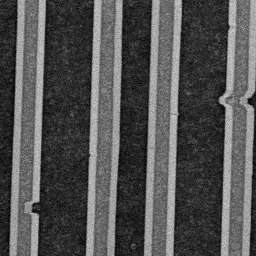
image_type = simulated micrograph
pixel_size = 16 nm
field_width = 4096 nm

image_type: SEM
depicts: one or a few lines or trenches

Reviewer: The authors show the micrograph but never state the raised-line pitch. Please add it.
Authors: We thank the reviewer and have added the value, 1130 nanometers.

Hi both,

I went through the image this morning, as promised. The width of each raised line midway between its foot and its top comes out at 348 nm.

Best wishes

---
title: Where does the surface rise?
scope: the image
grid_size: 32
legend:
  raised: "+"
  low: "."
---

...++.......+++....+++.......+++
...++.......+++....+++.......+++
...++.......+++....+++.......+++
...++.......+++....+++.......+++
...++.......+++....+++.......+++
...++.......+++....+++.......+++
...++.......+++....+++.......+++
..+++.......+++....+++.......++.
..+++.......+++....+++.......++.
..+++.......+++....+++.......++.
..+++.......+++....+++.......++.
..+++.......+++....+++.......++.
..+++.......+++....+++......+++.
..+++.......+++....+++......+++.
..+++.......+++....+++.......++.
..+++.......++.....+++.......++.
..+++.......+++....+++.......++.
..+++.......+++....+++.......++.
..+++.......++.....+++......+++.
..+++.......++.....+++......+++.
..+++.......++.....+++......+++.
..+++.......++.....+++......+++.
..+++.......++.....++.......+++.
..++.......+++.....++.......+++.
..++.......+++.....++.......+++.
..++.......+++.....++.......+++.
..++.......+++.....++.......+++.
..++.......+++.....++.......+++.
..++.......+++.....++.......+++.
..++.......+++.....++.......+++.
..++.......+++....+++.......+++.
..++.......+++....+++.......+++.